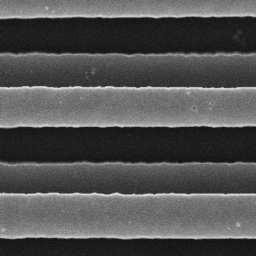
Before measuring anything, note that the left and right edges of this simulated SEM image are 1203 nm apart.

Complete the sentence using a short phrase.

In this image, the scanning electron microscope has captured lines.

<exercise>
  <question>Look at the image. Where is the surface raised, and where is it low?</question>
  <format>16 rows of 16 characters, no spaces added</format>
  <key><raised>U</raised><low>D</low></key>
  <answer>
UUUUUUUUUUUUUUUU
DDDDDDDDDDDDDDDD
DDDDDDDDDDDDDDDD
UUUUUUUUUUUUUUUU
UUUUUUUUUUUUUUUU
UUUUUUUUUUUUUUUU
UUUUUUUUUUUUUUUU
UUUUUUUUUUUUUUUU
DDDDDDDDDDDDDDDD
DDDDDDDDDDDDDDDD
UUUUUUUUUUUUUUUU
UUUUUUUUUUUUUUUU
UUUUUUUUUUUUUUUU
UUUUUUUUUUUUUUUU
UUUUUUUUUUUUUUUU
DDDDDDDDDDDDDDDD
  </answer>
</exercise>